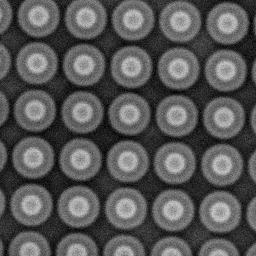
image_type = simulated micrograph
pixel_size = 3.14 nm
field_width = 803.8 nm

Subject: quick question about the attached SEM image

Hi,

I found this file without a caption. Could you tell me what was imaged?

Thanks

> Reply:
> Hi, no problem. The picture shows an array of small figures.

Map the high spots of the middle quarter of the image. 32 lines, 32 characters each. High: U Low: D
UUUUUUUUUUDDUUUUUUUUUUDDUUUUUUUU
UUUUUUUUUUDDUUUUUUUUUUDDUUUUUUUU
UUUUUUUUUUDDUUUUUUUUUUDDUUUUUUUU
DUUUUUUUUDDDUUUUUUUUUDDDUUUUUUUU
DDUUUUUUDDDDDUUUUUUUDDDDDUUUUUUU
DDDDDDDDDDDDDDDUUUUDDDDDDDUUUUUU
DDDDDDDDDDDDDDDDDDDDDDDDDDDDDDDD
DDUUUUUDDDDDDDDUUUDDDDDDDDDDDDDD
DUUUUUUUDDDDDUUUUUUUDDDDDDUUUUUD
UUUUUUUUUDDDUUUUUUUUUDDDUUUUUUUU
UUUUUUUUUUDDUUUUUUUUUDDDUUUUUUUU
UUUUUUUUUUDUUUUUUUUUUDDUUUUUUUUU
UUUUUUUUUUDUUUUUUUUUUDDUUUUUUUUU
UUUUUUUUUUDUUUUUUUUUUDDUUUUUUUUU
UUUUUUUUUDDDUUUUUUUUUDDUUUUUUUUU
DUUUUUUUDDDDUUUUUUUUUDDDUUUUUUUU
DDUUUUUDDDDDDUUUUUUUDDDDUUUUUUUU
DDDDDDDDDDDDDDDUUUDDDDDDDDUUUUUD
DDDDDDDDDDDDDDDDDDDDDDDDDDDDDDDD
DUUUUUUDDDDDDDUUUUDDDDDDDDDDDDDD
UUUUUUUUDDDDUUUUUUUDDDDDDUUUUUUD
UUUUUUUUUDDDUUUUUUUUDDDDUUUUUUUU
UUUUUUUUUDDUUUUUUUUUUDDUUUUUUUUU
UUUUUUUUUDDUUUUUUUUUUDDUUUUUUUUU
UUUUUUUUUDDUUUUUUUUUUDDUUUUUUUUU
UUUUUUUUUDDUUUUUUUUUUDDUUUUUUUUU
UUUUUUUUUDDUUUUUUUUUUDDUUUUUUUUU
UUUUUUUUDDDDUUUUUUUUDDDUUUUUUUUU
DDUUUUDDDDDDDUUUUUUDDDDDUUUUUUUD
DDDDDDDDDDDDDDDDDDDDDDDDDUUUUUDD
DDDDDDDDDDDDDDDDDDDDDDDDDDDDDDDD
DUUUUUUDDDDDDUUUUUDDDDDDDDDUDDDD